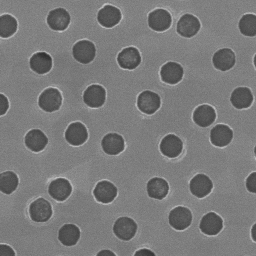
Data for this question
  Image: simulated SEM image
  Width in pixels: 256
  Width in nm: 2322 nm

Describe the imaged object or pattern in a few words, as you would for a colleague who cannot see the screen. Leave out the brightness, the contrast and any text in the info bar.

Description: a regular array of holes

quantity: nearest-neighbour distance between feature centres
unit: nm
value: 344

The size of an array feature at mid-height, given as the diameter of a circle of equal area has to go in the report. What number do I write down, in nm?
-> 212